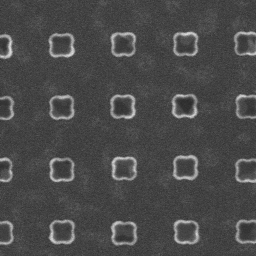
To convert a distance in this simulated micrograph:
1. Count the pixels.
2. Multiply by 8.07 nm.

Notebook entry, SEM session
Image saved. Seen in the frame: a regular array of raised bodies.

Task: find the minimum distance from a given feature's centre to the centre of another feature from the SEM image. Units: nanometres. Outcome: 498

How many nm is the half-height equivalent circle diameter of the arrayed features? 196